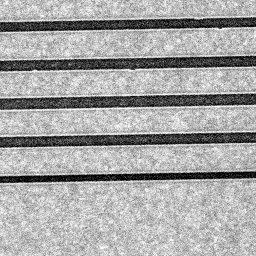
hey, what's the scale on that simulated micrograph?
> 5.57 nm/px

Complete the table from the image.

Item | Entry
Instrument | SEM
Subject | parallel lines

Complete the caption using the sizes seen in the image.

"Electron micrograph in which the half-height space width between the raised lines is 10.9 pixels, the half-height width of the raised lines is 149 nanometers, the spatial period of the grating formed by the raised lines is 215 nm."